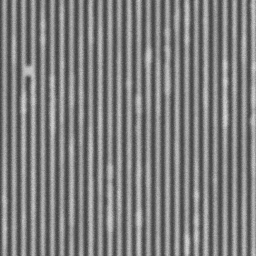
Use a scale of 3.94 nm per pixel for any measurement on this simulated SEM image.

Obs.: parallel lines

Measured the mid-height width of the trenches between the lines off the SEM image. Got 0.0187 microns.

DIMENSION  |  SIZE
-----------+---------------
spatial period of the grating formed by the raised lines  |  37.8 nm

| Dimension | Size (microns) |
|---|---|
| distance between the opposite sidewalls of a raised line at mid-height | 0.0187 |